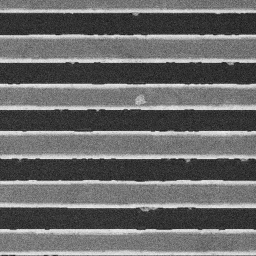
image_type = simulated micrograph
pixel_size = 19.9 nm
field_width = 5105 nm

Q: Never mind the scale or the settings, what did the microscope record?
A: lines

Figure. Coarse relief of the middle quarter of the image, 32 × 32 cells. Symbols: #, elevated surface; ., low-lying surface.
................................
................................
................................
................................
................................
................#####.........##
################################
################################
################################
################################
################################
................................
................................
................................
................................
................................
................................
################################
################################
################################
################################
################################
################################
................................
................................
................................
................................
................................
................................
................................
################################
################################